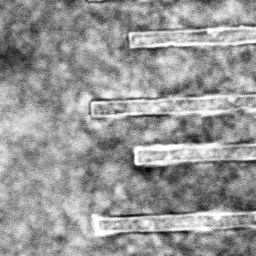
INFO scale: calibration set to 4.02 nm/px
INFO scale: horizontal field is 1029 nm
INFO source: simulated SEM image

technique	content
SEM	parallel lines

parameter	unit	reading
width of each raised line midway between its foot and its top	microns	0.0562